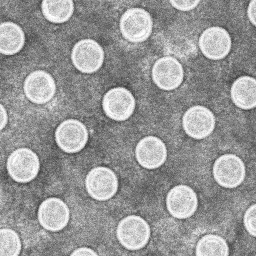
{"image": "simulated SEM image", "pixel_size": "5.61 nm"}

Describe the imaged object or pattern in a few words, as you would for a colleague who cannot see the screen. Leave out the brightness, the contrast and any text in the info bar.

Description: a regular array of raised bodies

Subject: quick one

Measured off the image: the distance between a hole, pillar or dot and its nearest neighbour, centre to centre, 318 nm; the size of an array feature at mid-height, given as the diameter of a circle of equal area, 174 nm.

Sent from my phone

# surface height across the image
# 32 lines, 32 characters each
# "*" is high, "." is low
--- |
.....****.............***......*
.....****.......**.............*
......**.......****............*
**.............****.............
***.............**.......****...
***.......**.............****...
**.......****............***....
.........****.......**..........
..........**.......****.........
....**.............****.........
...****.............**.......***
...****.......**.............***
....**.......****............***
.............****.......*.......
*.............**.......****.....
*.......**.............****.....
.......****............***......
.......****.......**............
........**.......****...........
.***.............****.......*...
.****.............**.......***..
.****......***.............****.
..**.......****............***..
...........****.......**........
............**.......***........
.....***.............****.......
.....****............***.......*
.....***........**.............*
......**.......****............*
**.............****.......*.....
**.............***.......***....
**.......***.............***....